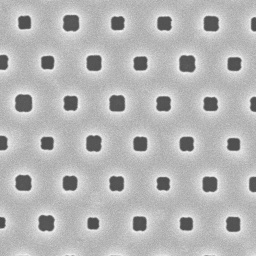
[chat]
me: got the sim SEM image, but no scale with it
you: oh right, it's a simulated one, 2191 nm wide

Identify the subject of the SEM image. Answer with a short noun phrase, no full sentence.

a regular array of holes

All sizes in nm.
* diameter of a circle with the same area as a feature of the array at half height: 143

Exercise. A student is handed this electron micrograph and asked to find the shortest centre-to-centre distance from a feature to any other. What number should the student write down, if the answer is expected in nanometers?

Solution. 395